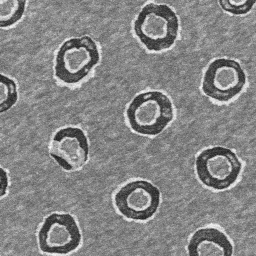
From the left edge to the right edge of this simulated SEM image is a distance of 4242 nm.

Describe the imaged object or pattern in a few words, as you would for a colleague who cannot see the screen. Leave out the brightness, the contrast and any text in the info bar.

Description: ring-shaped grooves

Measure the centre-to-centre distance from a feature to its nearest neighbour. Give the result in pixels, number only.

84.4